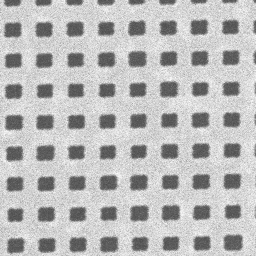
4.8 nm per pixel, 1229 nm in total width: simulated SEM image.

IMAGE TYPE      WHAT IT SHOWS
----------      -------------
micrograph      a regular array of holes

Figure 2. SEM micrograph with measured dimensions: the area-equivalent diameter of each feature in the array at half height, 85 nm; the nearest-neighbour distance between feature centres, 0.147 µm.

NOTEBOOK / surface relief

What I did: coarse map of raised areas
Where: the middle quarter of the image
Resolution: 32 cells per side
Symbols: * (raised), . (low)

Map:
*....****...****....****....****
********************************
********************************
********************************
************************....****
*....****....***.....***.....***
*....****....***.....***.....***
*....***.....***.....***.....***
*********.***************.******
********************************
********************************
********************************
*****************...*****...****
*....****....***.....***....****
*....****....***.....***....****
*....****....***.....***....****
********************************
********************************
********************************
********************************
**...****....****....***.....***
*....****....****....***.....***
*....****....****....***.....***
*....****....****...*****...****
********************************
********************************
********************************
********************************
*....****....***.....****....***
*....****....***.....***.....***
*....****.....**.....***.....***
**...****....****...*****.*.****